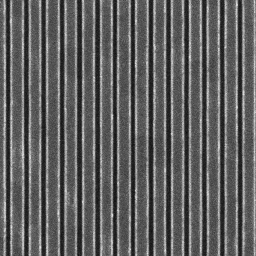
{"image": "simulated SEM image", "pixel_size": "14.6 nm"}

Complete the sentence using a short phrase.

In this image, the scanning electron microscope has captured parallel lines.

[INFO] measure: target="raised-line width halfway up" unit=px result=12.5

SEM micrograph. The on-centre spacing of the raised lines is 260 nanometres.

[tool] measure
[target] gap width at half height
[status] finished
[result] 78.3 nm